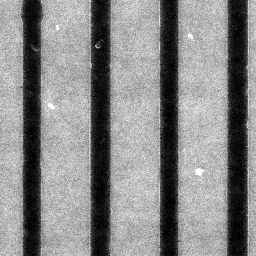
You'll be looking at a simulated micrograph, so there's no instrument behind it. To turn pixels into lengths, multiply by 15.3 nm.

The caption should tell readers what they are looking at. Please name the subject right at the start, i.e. one or a few lines or trenches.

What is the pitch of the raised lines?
1050 nm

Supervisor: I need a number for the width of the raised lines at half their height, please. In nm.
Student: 303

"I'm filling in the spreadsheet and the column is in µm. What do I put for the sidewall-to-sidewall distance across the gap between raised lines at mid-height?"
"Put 0.738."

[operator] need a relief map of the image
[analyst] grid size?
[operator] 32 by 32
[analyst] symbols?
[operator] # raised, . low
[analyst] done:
...##......###......##......##..
...##......###......##......###.
...##......###......##......###.
...##......###......##......###.
...##......###......##......###.
...##......###......##......###.
...##......###......##.......##.
...##......###......##......###.
...##......###......##......###.
...##......###......##......###.
...##......###......##......###.
...##......###......##......###.
...##......###......##......###.
...##......###......##......###.
...##......###......##......###.
...##......###......##......###.
...##......###......##.......##.
...##......###......##......###.
...##......###......##......###.
...##......###......##......###.
...##......###......##......###.
...##......###......##......###.
...##......###......##......###.
...##......###......##......###.
...##......###......##......###.
...##......###......##......###.
...##......###......##......###.
...##......###......##......###.
...##......###......##......###.
...##......###......##......###.
...##......###......##......###.
...##......###......##......###.